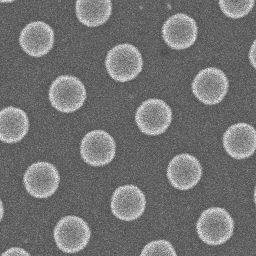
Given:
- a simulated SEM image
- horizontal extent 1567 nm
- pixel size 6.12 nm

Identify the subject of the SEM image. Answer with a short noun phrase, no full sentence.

a regular array of raised bodies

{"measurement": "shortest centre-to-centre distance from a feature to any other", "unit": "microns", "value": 0.384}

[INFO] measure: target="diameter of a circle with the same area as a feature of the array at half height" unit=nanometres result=205